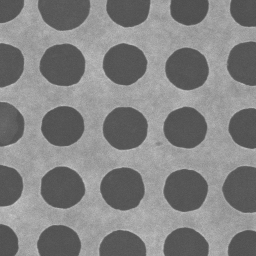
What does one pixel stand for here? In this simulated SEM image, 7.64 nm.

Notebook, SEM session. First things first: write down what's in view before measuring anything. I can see a regular array of holes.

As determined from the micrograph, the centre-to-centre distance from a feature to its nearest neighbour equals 460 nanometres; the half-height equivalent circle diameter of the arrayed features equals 329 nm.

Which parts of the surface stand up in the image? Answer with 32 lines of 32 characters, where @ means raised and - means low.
---@@------@@------@@-----@@@---
---@@------@@------@@-----@@@---
-@@@@------@@@----@@@@---@@@@---
@@@@@@@--@@@@@@@@@@@@@@@@@@@@@@@
@@@@@@@@@@@@@@@@@@@@@@@@@@@@@@@@
-@@@@@@-@@@@@@@-@@@@@@@@@@@@@@--
---@@@----@@@-----@@@@---@@@@---
---@@------@@-----@@@-----@@----
---@@------@@-----@@@-----@@----
---@@-----@@@-----@@@-----@@@---
--@@@@---@@@@@@--@@@@@---@@@@@@-
@@@@@@@@@@@@@@@@@@@@@@@@@@@@@@@@
@@@@@@@@@@@@@@@@@@@@@@@@@@@@@@@@
--@@@@@--@@@@@@-@@@@@@@-@@@@@@@@
---@@@----@@@-----@@@----@@@@---
---@@------@@-----@@@-----@@@---
---@@-----@@@-----@@@-----@@@---
--@@@@----@@@-----@@@----@@@@---
@@@@@@@@@@@@@@---@@@@@@-@@@@@@@-
@@@@@@@@@@@@@@@@@@@@@@@@@@@@@@@@
@@@@@@@@@@@@@@@@@@@@@@@@@@@@@@@@
--@@@@---@@@@@---@@@@@---@@@@---
---@@-----@@@-----@@@-----@@----
---@@------@------@@------@@----
---@@-----@@@-----@@@-----@@----
--@@@@----@@@----@@@@----@@@@---
@@@@@@@@@@@@@@@@@@@@@@@@@@@@@@--
@@@@@@@@@@@@@@@@@@@@@@@@@@@@@@@@
-@@@@@---@@@@@@@@@@@@@--@@@@@@@@
--@@@-----@@@----@@@@----@@@@---
--@@@-----@@@-----@@------@@@---
--@@@-----@@------@@------@@@---